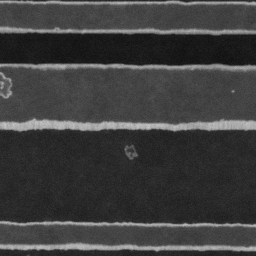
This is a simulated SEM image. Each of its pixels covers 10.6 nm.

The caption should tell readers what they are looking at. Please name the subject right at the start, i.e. lines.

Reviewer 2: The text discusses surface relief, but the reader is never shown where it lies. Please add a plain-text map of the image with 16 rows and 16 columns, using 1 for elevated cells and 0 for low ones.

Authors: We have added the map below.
1111111111111111
1111111111111111
0000000000000000
0000000000000000
1111111111111111
1111111111111111
1111111111111111
1111111111111111
0000000000000000
0000000000000000
0000000000000000
0000000000000000
0000000000000000
0000000000000000
1111111111111111
0111011111111111